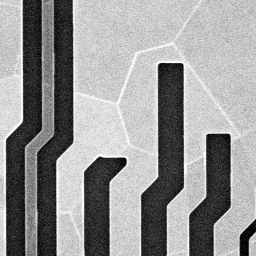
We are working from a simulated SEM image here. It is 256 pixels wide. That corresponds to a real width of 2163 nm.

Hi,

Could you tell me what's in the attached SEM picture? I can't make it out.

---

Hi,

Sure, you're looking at groups of lines, slits or small figures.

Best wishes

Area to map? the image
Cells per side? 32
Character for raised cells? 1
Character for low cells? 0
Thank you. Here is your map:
11100110011111111111111111111111
11100110011111111111111111111111
11100110011111111111111111111111
11100110011111111111111111111111
11100110011111111111111111111111
11100110011111111111111111111111
11100110011111111111111111111111
11100110011111111111111111111111
11100110011111111111000111111111
11100110011111111111000111111111
11100110011111111111000111111111
11100110011111111111000111111111
11100110011111111111000111111111
11100110011111111111000111111111
11100110011111111111000111111111
11000110011111111111000111111111
11000110011111111111000111111111
10001100011111111111000111000111
10011000011111111111000111000111
10011000111101111111000111000111
10010001111000001111000111000111
10010001111000011111000111000111
10010001110000111110000111000111
10010001110000111100000111000111
10010001110000111100001111000111
10010001110000111100011110000111
10010001110000111100011100001111
10010001110000111100011000011111
10010001110000111100011000011110
10011001110000111100011000011100
10011001110000111100011000011101
10011001110000111100011000011101